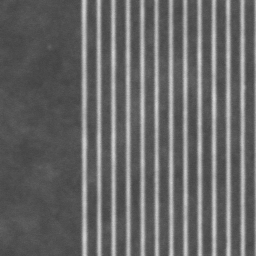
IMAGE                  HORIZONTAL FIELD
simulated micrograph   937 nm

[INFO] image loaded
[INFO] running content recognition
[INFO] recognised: parallel lines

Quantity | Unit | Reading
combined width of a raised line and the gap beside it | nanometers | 52.6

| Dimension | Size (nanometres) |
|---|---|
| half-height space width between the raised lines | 40.3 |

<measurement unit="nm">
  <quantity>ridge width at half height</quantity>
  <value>12.4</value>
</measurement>